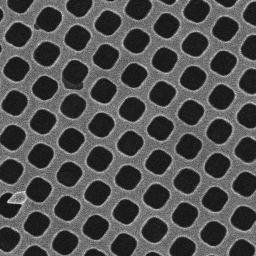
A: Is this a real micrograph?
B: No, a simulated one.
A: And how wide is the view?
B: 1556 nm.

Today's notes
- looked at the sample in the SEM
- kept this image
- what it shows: a regular array of holes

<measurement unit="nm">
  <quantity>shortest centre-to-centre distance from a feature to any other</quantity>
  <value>206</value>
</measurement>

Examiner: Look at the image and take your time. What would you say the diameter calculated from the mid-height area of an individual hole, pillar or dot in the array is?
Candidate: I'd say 0.148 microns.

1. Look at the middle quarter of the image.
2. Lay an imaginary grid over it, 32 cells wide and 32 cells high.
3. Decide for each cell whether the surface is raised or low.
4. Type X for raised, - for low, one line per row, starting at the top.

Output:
X-----XX----XXXX---XXX------XXXX
------XXXXXXXXX------XXX---XXX--
------XXXXXXXX-------XXXXXXXXX--
-----XXXXXXXXX------XXXXXXXXX---
-----XXX----XXX-----XXXX-XXXX---
-----XX------XXX---XXXX----XXX--
XXX-XXX------XXXXXXXXX------XXXX
XX-XXXX------XXXXXXXX-------XXXX
-----XX-----XXXX--XXX------XXXXX
-----XXXX--XXXX-----XX-----XXX--
------XXXXXXXX------XXXX-XXXXX--
-----XXXXXXXXX------XXXXXXXXX---
----XXXX--XXXX------XXXXXXXX----
X--XXXX-----XXX----XXXX---XXX---
XXXXXXX------XXXXXXXXX-----XXX--
XXXXXX-------XXXXXXXX------XXXXX
---XXX------XXXXXXXXX------XXXXX
-----XX----XXXX---XXX-----XXXXXX
-----XXXXXXXXX------XX----XXX---
-----XXXXXXXX-------XXXXXXXXX---
----XXXXXXXXX------XXXXXXXXX----
---XXXX----XXX-----XXXX-XXXX----
XXXXXX------XXX---XXXX----XXX---
XXXXXX------XXXXXXXXX------XXX--
X-XXXX------XXXXXXXX-------XXXXX
---XXX-----XXXX--XXX------XXXXXX
----XXXX--XXXX----XXX----XXXXX--
-----XXXXXXXX------XXXX-XXXXX---
----XXXXXXXXX------XXXXXXXXX----
---XXXX--XXXX------XXXXXXXX-----
--XXXX-----XXX----XXXX--XXXX----
XXXXXX------XXXX-XXXX-----XXX---